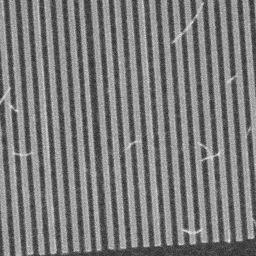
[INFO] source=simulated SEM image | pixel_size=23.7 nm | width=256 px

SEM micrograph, parallel lines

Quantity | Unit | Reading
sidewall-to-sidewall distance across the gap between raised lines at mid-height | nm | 148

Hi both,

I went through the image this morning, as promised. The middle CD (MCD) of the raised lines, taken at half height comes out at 0.124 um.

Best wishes